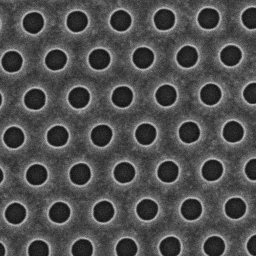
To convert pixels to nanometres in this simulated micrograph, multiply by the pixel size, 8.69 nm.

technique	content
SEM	a regular array of holes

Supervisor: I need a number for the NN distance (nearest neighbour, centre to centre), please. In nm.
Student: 378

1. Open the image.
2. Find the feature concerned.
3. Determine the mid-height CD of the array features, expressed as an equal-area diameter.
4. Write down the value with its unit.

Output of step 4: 195 nm